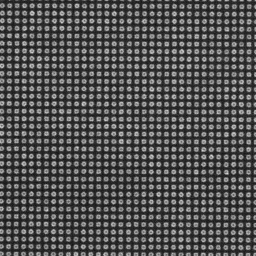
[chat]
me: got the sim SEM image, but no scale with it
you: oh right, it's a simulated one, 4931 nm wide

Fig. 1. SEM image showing a regular array of raised bodies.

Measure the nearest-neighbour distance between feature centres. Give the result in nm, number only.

140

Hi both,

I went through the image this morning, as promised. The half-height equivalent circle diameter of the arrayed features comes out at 81.3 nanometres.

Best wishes